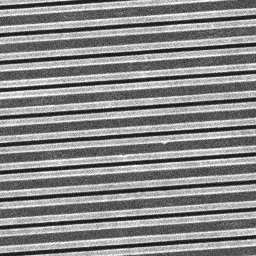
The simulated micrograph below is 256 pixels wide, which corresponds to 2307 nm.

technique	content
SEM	parallel lines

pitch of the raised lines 13.7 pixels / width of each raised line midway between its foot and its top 60.6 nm